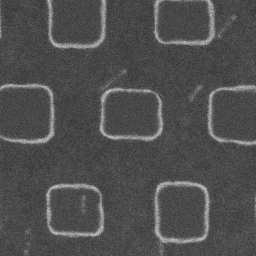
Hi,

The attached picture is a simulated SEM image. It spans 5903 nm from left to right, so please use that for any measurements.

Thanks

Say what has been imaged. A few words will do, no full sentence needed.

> raised bodies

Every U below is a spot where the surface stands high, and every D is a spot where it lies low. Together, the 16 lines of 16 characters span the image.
DDDUUUDDDDUUUDDD
DDDUUUDDDDUUUDDD
DDDUUUDDDDUUUDDD
DDDDDDDDDDDDDDDD
DDDDDDDDDDDDDDDD
UUUDDDDDDDDDDDDU
UUUDDDUUUUDDDUUU
UUUDDDUUUUDDDUUU
UUUDDDDUUUDDDUUU
DDDDDDDDDDDDDDDD
DDDDDDDDDDDDDDDD
DDDDDDDDDDUUDDDD
DDDUUUDDDDUUUDDD
DDDUUUDDDDUUUDDD
DDDDUUDDDDUUUDDD
DDDDDDDDDDDDDDDD